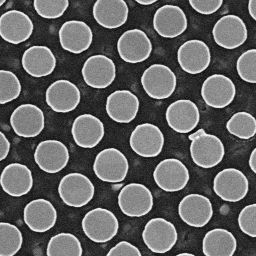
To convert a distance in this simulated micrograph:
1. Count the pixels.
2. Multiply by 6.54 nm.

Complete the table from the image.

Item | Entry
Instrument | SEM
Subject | a regular array of raised bodies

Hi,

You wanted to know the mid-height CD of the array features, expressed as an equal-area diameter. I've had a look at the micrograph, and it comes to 0.213 um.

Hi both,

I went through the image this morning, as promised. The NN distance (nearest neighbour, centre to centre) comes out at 276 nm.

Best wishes